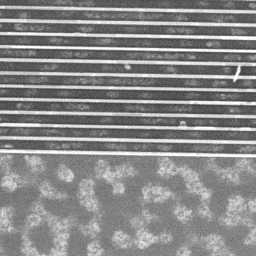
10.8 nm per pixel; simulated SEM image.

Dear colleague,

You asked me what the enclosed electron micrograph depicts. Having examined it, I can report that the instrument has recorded parallel lines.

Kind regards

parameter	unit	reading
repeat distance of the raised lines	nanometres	141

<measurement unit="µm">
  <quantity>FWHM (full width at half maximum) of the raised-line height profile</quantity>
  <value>0.0217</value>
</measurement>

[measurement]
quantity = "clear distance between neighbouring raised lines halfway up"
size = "118 nanometers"